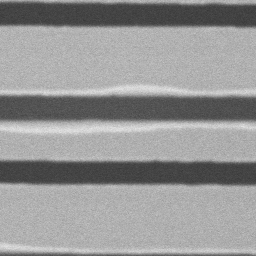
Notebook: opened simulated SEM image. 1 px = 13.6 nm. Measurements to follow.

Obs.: lines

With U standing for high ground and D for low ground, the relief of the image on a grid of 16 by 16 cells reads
DDDDDDDDDDDDDDDD
DDDDDDDDDDDDDDDD
UUUUUUUUUUUUUUUU
UUUUUUUUUUUUUUUU
UUUUUUUUUUUUUUUU
UUUUUUUUUUUUUUUU
DDDDDDDDDDDDDDDD
DDDDDDDDDDDDDDDD
UUUUUUUUUUUUUUUU
UUUUUUUUUUUUUUUU
DDDDDDDDDDDDDDDD
DDDDDDDDDDDDDDDD
UUUUUUUUUUUUUUUU
UUUUUUUUUUUUUUUU
UUUUUUUUUUUUUUUU
UUUUUUUUUUUUUUUU